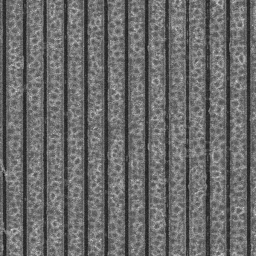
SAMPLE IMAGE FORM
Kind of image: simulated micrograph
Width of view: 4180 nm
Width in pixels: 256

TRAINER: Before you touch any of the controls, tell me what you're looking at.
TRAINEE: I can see parallel lines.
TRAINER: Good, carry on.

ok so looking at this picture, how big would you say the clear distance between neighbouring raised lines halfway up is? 73.5 nanometers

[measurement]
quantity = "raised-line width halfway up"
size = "0.255 um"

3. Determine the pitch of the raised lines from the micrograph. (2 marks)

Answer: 332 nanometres